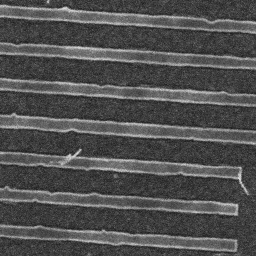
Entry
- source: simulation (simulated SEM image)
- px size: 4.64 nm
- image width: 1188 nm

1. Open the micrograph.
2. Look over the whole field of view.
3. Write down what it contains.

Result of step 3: parallel lines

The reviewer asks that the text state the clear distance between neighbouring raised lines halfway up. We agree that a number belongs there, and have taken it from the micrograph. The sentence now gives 0.122 microns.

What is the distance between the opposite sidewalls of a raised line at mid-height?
46.3 nanometers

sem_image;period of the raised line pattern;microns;0.169